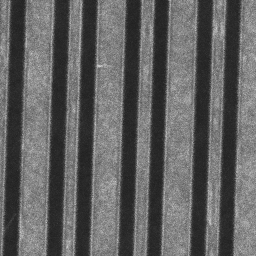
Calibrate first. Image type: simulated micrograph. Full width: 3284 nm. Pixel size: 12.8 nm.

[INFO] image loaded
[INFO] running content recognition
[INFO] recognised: parallel lines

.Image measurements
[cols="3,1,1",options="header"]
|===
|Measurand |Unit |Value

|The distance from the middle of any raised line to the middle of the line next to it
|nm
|460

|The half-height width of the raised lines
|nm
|229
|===